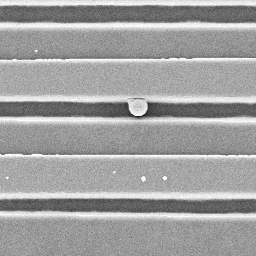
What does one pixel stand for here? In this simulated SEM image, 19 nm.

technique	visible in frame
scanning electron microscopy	lines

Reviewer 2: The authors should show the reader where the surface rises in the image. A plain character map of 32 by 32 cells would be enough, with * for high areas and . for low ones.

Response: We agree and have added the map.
................................
................................
................................
********************************
********************************
********************************
********************************
********************************
********************************
********************************
********************************
********************************
................***.............
................**..............
................................
********************************
********************************
********************************
********************************
********************************
********************************
********************************
********************************
********************************
.......................**.....*.
................................
................................
********************************
********************************
********************************
********************************
********************************